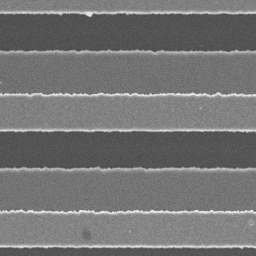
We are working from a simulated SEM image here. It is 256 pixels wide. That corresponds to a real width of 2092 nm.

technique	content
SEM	lines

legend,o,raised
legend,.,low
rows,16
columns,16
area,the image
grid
oooooooooooooooo
................
................
oooooooooooooooo
oooooooooooooooo
oooooooooooooooo
oooooooooooooooo
oooooooooooooooo
................
................
................
oooooooooooooooo
oooooooooooooooo
oooooooooooooooo
oooooooooooooooo
................